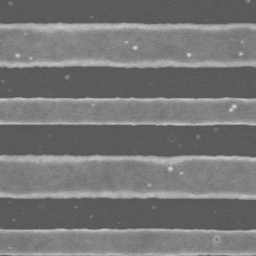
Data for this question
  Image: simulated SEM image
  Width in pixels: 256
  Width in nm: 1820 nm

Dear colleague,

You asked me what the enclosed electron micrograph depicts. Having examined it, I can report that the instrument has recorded lines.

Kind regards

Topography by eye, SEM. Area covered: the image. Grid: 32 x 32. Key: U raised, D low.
DDDDDDDDDDDDDDDDDDDDDDDDDDDDDDDD
DDDDDDDDDDDDDDDDDDDDDDDDDDDDDDDD
DDDDDDDDDDDDDDDDDDDDDDDDDDDDDDDD
UUUUUUUUUUUUUUUUUUUUUUUUUUUUUUUU
UUUUUUUUUUUUUUUUUUUUUUUUUUUUUUUU
UUUUUUUUUUUUUUUUUUUUUUUUUUUUUUUU
UUUUUUUUUUUUUUUUUUUUUUUUUUUUUUUU
UUUUUUUUUUUUUUUUUUUUUUUUUUUUUUUU
DDDDDDDDDDDDDDDDDDDDDDDDDDDDDDDD
DDDDDDDDDDDDDDDDDDDDDDDDDDDDDDDD
DDDDDDDDDDDDDDDDDDDDDDDDDDDDDDDD
DDDDDDDDDDDDDDDDDDDDDDDDDDDDDDDD
UUUUUUUUUUUUUUUUUUUUUUUUUUUUUUUU
UUUUUUUUUUUUUUUUUUUUUUUUUUUUUUUU
UUUUUUUUUUUUUUUUUUUUUUUUUUUUUUUU
UUUUUUUUUUUUUUUUUUUUUUUUUUUUUUUU
DDDDDDDDDDDDDDDDDDDDDDDDDDDDDDDD
DDDDDDDDDDDDDDDDDDDDDDDDDDDDDDDD
DDDDDDDDDDDDDDDDDDDDDDDDDDDDDDDD
DDDDDDDDDDDDDDDDDDDDDDDDDDDDDDDD
UUUUUUUUUUUUUUUUUUUUUUUUUUUUUUUU
UUUUUUUUUUUUUUUUUUUUUUUUUUUUUUUU
UUUUUUUUUUUUUUUUUUUUUUUUUUUUUUUU
UUUUUUUUUUUUUUUUUUUUUUUUUUUUUUUU
UUUUUUUUUUUUUUUUUUUUUUUUUUUUUUUU
DDDDDDDDDDDDDDDDDDDDDDDDDDDDDDDD
DDDDDDDDDDDDDDDDDDDDDDDDDDDDDDDD
DDDDDDDDDDDDDDDDDDDDDDDDDDDDDDDD
DDDDDDDDDDDDDDDDDDDDDDDDDDDDDDDD
UUUUUUUUUUUUUUUUUUUUUUUUUUUUUUUU
UUUUUUUUUUUUUUUUUUUUUUUUUUUUUUUU
UUUUUUUUUUUUUUUUUUUUUUUUUUUUUUUU